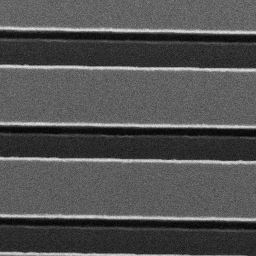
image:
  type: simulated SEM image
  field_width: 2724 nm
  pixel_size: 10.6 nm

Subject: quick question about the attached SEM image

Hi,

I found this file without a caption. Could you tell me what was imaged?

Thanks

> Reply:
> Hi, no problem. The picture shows lines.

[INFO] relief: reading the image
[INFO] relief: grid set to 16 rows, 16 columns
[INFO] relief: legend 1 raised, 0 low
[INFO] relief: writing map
1111111111111111
1111111111111111
0000000000000000
0000000000000000
1111111111111111
1111111111111111
1111111111111111
1111111111111111
0000000000000000
0000000000000000
1111111111111111
1111111111111111
1111111111111111
1111111111111111
0000000000000000
0000000000000000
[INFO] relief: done